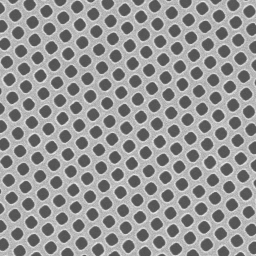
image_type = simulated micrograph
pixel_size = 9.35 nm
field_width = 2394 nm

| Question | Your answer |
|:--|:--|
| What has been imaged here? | a regular array of holes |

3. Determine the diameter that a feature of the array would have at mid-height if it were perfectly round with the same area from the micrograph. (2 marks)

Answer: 114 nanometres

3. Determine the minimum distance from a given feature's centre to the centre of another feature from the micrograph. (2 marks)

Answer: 0.164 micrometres